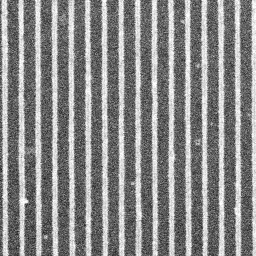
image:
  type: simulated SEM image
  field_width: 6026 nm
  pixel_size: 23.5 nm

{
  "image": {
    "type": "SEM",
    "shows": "parallel lines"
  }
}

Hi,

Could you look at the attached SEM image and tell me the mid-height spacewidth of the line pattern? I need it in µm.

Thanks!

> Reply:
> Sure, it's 0.315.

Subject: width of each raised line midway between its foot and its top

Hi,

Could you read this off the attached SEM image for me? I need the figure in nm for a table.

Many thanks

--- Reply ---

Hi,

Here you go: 82.4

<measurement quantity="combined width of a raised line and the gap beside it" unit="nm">392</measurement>